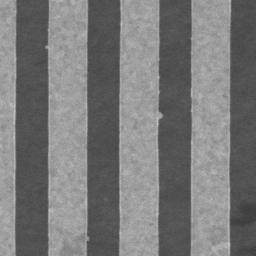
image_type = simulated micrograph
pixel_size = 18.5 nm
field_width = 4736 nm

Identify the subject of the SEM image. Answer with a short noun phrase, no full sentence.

wiring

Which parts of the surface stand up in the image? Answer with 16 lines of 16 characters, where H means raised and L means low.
HLLHHLLLHHLLHHLL
HLLHHLLLHHLLHHLL
HLLHHLLLHHLLHHLL
HLLHHLLLHHLLHHLL
HLLHHLLLHHLLHHLL
HLLHHLLLHHLLHHLL
HLLHHLLLHHLLHHLL
HLLHHLLLHHLLHHLL
HLLHHLLLHHLLHHLL
HLLHHLLLHHLLHHLL
HLLHHLLLHHLLHHLL
HLLHHLLLHHLLHHLL
HLLHHLLLHHLLHHLL
HLLHHLLLHHLLHHLL
HLLHHLLLHHLLHHLL
HLLHHLLHHHLLHHLL